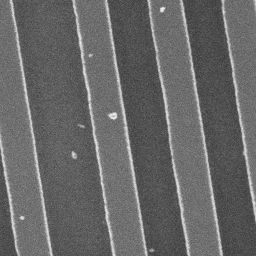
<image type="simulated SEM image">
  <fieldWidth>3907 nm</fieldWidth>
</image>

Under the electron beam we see lines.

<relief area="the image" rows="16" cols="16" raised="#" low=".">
#....##..##...##
#....##..###..##
#....##...##..##
#....##...##..##
#....##...##...#
##...###..##...#
##....##..##...#
##....##..###..#
##....##...##..#
##....##...##..#
##....##...##..#
###...###..##...
.##....##..##...
.##....##..###..
.##....##...##..
.##....##...##..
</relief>